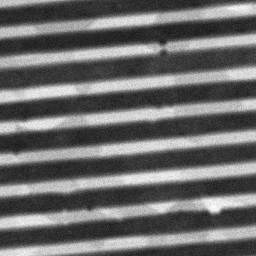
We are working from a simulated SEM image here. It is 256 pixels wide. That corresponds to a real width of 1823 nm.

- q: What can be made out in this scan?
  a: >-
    parallel lines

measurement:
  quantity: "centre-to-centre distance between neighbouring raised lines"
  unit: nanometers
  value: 225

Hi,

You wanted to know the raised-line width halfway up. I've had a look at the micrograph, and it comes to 87 nanometres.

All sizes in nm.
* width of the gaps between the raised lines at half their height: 136